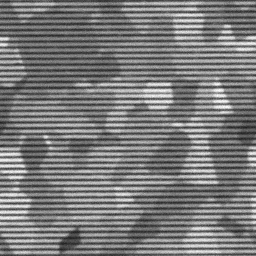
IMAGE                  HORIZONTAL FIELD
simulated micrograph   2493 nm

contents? parallel lines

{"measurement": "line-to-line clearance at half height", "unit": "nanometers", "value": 32.9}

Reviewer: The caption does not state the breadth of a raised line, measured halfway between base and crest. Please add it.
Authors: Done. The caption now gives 23.1 nm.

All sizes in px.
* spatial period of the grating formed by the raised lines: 5.77